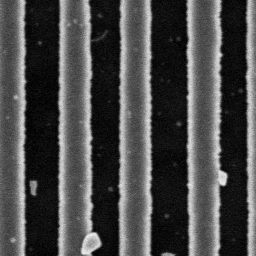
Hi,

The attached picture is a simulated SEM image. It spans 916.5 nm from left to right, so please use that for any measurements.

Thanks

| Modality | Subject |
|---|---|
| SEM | lines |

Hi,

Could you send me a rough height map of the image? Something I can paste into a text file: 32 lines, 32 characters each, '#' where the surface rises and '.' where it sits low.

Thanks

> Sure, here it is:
###.....###....####....####....#
###.....###....####....####....#
###.....###....####....####....#
###....####....####....####....#
###....####....####.....####...#
###....####....####....#####...#
###....####....####....####....#
###....####....####....####....#
###....####....####....####....#
###....####....####....####....#
###....####....####.....###....#
###....####....####.....###....#
###....####....####....####....#
###....####....####.....###....#
###....####....####.....###....#
###....####....####....####....#
###....####....####....####....#
###....####....####.....###....#
###....####....####....####....#
###....####....####.....###....#
###....####....####.....###....#
###....####....####.....####...#
###....####....####.....####...#
###....####....####.....###....#
###....####....####.....###....#
###....####....####.....###....#
###....####....####.....###....#
###....####....####.....###....#
###....####....####.....###....#
###....#####...####.....###....#
###....######..####.....###....#
###....#####...####.....###....#